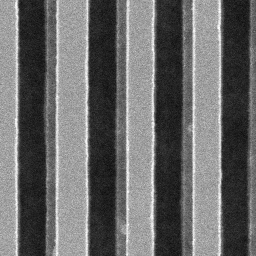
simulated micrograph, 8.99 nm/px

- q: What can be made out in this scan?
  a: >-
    lines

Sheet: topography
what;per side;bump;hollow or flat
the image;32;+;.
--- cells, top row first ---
++....+++++....++++....+++++...+
++....+++++....++++....+++++...+
++....+++++....++++....+++++...+
++....+++++....++++....+++++...+
++....+++++....++++....+++++...+
++....+++++....++++....+++++...+
++....+++++....++++....+++++...+
++....+++++....++++....+++++...+
++....+++++....++++....+++++...+
++....+++++....++++....+++++...+
++....+++++....++++....+++++...+
++....+++++....++++....+++++...+
++....+++++....++++....+++++...+
++....+++++....++++....+++++...+
++....+++++....++++....+++++...+
++....+++++....++++....+++++...+
++....+++++....++++....+++++...+
++....+++++....++++....+++++...+
++....+++++....++++....+++++...+
++....+++++....++++....+++++...+
++....+++++....++++....+++++...+
++....+++++....++++....+++++...+
++....+++++....++++....+++++...+
++....+++++....++++....+++++...+
++....+++++....++++....+++++...+
++....+++++....++++....+++++...+
++....+++++....++++....+++++...+
++....+++++....++++....+++++...+
++....+++++....++++....+++++...+
++....+++++....++++....+++++...+
++....+++++....++++....+++++...+
++....+++++....++++....+++++...+